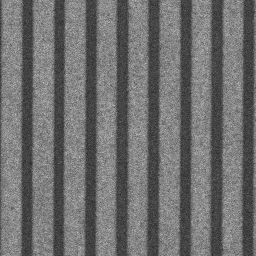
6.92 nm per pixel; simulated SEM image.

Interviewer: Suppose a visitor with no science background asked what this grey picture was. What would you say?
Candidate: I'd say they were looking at parallel lines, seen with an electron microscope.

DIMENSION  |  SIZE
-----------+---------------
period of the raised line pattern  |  218 nm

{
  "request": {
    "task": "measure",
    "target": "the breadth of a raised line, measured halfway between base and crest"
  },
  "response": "147 nm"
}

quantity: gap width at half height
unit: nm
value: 76.1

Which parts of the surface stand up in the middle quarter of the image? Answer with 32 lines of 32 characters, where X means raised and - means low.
XXXXX---XXXXX---XXXXX---XXXXX---
XXXXX---XXXXX---XXXXX---XXXXX---
XXXXX---XXXXX---XXXXX---XXXXX---
XXXXX---XXXXX---XXXXX---XXXXX---
XXXXX---XXXXX---XXXXX---XXXXX---
XXXXX---XXXXX---XXXXX---XXXXX---
XXXXX---XXXXX---XXXXX---XXXXX---
XXXXX---XXXXX---XXXXX---XXXXX---
XXXXX---XXXXX---XXXXX---XXXXX---
XXXXX---XXXXX---XXXXX---XXXXX---
XXXXX---XXXXX---XXXXX---XXXXX---
XXXXX---XXXXX---XXXXX---XXXXX---
XXXXX---XXXXX---XXXXX---XXXXX---
XXXXX---XXXXX---XXXXX---XXXXX---
XXXXX---XXXXX---XXXXX---XXXXX---
XXXXX---XXXXX---XXXXX---XXXXX---
XXXXX---XXXXX---XXXXX---XXXXX---
XXXXX---XXXXX---XXXXX---XXXXX---
XXXXX---XXXXX---XXXXX---XXXXX---
XXXXX---XXXXX---XXXXX---XXXXX---
XXXXX---XXXXX---XXXXX---XXXXX---
XXXXX---XXXXX---XXXXX---XXXXX---
XXXXX---XXXXX---XXXXX---XXXXX---
XXXXX---XXXXX---XXXXX---XXXXX---
XXXXX---XXXXX---XXXXX---XXXXX---
XXXXX---XXXXX---XXXXX---XXXXX---
XXXXX---XXXXX---XXXXX---XXXXX---
XXXXX---XXXXX---XXXXX---XXXXX---
XXXXX---XXXXX---XXXXX---XXXXX---
XXXXX---XXXXX---XXXXX---XXXXX---
XXXXX---XXXXX---XXXXX---XXXXX---
XXXXX---XXXXX---XXXXX---XXXXX---